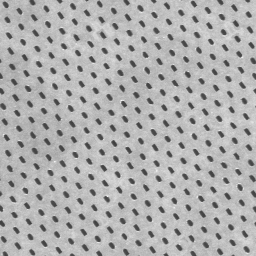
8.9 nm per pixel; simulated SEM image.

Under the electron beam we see a regular array of holes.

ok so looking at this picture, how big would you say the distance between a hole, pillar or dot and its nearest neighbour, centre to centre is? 133 nm